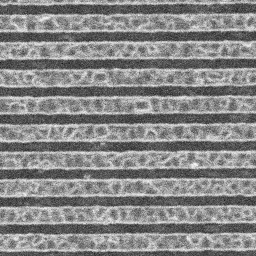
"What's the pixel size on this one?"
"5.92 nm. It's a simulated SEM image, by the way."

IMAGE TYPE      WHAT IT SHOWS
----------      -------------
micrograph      parallel lines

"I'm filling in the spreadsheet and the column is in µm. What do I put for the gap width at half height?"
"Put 0.0666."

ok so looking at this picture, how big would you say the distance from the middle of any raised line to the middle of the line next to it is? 162 nm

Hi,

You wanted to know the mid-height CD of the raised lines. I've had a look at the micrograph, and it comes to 97 nm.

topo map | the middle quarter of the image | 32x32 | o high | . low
................................
......o..o...o.......oo.......oo
oooooooooooooooooooooooooooooooo
oooooooooooooooooooooooooooooooo
oooooooooooooooooooooooooooooooo
o...............................
................................
................................
.........o..oooooooooooooooooooo
oooooooooooooooooooooooooooooooo
oooooooooooooooooooooooooooooooo
oooooooooooooooooooooooooooooooo
................................
................................
................................
oooooooooooooooooooooooooooooooo
oooooooooo.ooooooooooooooooooooo
oooooooooo.ooooooooooooooooooooo
.ooooooooooooooooooooooooooooooo
................................
................................
................................
oooooooooooooooooooooooooooooooo
oooooooooooooooooooooooooooooooo
oooooooooooooooooooooooooooooooo
oooooooooooooooooooooooooooooooo
................................
................................
................................
oooooooooooooooooooooooooooooooo
oooooooooooooooooooooooooooooooo
oooooooooooooooooooooooooooooooo